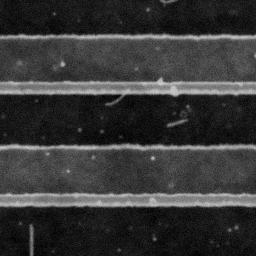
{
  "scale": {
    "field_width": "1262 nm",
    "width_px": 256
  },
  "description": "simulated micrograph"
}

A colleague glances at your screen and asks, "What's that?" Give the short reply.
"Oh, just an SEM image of lines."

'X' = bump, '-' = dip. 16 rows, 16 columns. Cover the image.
----------------
----------------
XXXXXXXXXXXXXXXX
XXXXXXXXXXXXXXXX
XXXXXXXXXXXXXXXX
XXXXXXXXXXXXXXXX
----------------
----------------
----------------
XXXXXXXXXXXXXXXX
XXXXXXXXXXXXXXXX
XXXXXXXXXXXXXXXX
XXXXXXXXXXXXXXXX
----------------
----------------
----------------